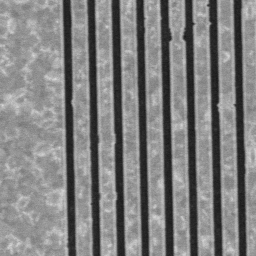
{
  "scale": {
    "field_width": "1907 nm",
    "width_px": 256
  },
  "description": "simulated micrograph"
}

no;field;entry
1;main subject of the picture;parallel lines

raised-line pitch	181	nanometers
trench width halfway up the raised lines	80.9	nanometers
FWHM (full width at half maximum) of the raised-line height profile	13.9	pixels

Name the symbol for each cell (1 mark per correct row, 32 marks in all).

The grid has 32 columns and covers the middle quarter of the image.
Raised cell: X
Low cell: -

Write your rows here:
--XXXX---XXX---XXX---XXX---XXX--
--XXXX---XXX---XXX---XXX---XXX--
--XXXX---XXX---XXX---XXX---XXX--
--XXXX---XXX---XXX---XXX---XXX--
---XXX---XXX---XXX---XXX---XXX--
---XXX---XXX---XXX---XXX---XXX--
---XXX---XXX---XXX---XXX---XXX--
---XXX---XXX---XXX---XXX---XXX--
--XXXX---XXX---XXX---XXX---XXX--
--XXXX---XXX---XXX---XXX---XXX--
--XXXX---XXX---XXX---XXX---XXX--
---XXX---XXX---XXX---XXX---XXX--
---XXX---XXX---XXX---XXX---XXX--
---XXX---XXX---XXX---XXX---XXX--
---XXX---XXX---XXX---XXX---XXX--
---XXX---XXX---XXX---XXX---XXX--
---XXX---XXX---XXX---XXX---XXX--
---XXX---XXX---XXX---XXX---XXX--
---XXX---XXX---XXX---XXX---XXX--
---XXX---XXX---XXX---XXX---XXX--
---XXX---XXX---XXX---XXX---XXX--
---XXX---XXX---XXX---XXX---XXX--
---XXX---XXX---XXX---XXXX--XXX--
---XXX---XXX---XXX---XXXX--XXX--
---XXX---XXX---XXX---XXXX---XXX-
---XXX---XXX---XXX---XXXX--XXXX-
---XXX---XXX---XXX---XXXX--XXXX-
---XXX---XXX---XXX---XXXX--XXXX-
---XXX---XXX---XXX---XXXX--XXXX-
---XXX---XXX---XXX---XXXX---XXX-
---XXX---XXX---XXX---XXXX---XXX-
---XXX---XXX---XXX---XXXX---XXX-